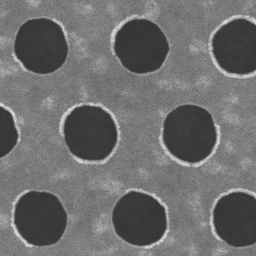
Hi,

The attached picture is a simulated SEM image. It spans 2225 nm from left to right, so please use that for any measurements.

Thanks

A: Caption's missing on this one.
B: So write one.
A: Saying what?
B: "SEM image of holes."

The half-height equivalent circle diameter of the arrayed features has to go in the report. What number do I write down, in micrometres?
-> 0.476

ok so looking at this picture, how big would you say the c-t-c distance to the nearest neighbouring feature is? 0.862 micrometres